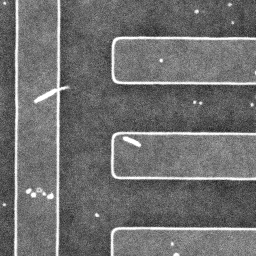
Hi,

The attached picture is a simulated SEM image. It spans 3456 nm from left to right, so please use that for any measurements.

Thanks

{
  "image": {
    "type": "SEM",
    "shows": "groups of lines, slits or small figures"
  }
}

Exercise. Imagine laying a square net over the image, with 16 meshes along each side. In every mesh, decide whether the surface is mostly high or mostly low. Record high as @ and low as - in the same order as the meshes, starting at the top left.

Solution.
-@@@------------
-@@@------------
-@@@---@@@@@@@@@
-@@@---@@@@@@@@@
-@@@---@@@@@@@@@
-@@@------------
-@@@------------
-@@@------------
-@@@---@@@@@@@@@
-@@@---@@@@@@@@@
-@@@---@@@@@@@@@
-@@@------------
-@@@------------
-@@@------------
-@@@---@@@@@@@@@
-@@@---@@@@@@@@@